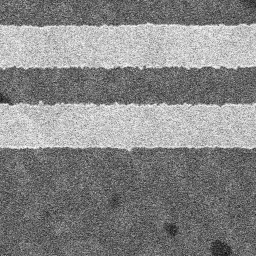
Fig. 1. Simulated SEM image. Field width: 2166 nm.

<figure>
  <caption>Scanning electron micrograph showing one or a few lines or trenches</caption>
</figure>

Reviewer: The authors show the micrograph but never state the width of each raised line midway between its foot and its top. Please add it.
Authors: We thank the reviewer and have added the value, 352 nm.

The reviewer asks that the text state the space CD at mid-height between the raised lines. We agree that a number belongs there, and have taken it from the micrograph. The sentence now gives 323 nanometers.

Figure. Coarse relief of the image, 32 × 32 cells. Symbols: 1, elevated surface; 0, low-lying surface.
00000000000000000000000000000000
00000000000000000000000000000000
00000000000000000000000000000000
11111111111111111111111111111111
11111111111111111111111111111111
11111111111111111111111111111111
11111111111111111111111111111111
11111111111111111111111111111111
00010000000000000000000000000000
00000000000000000000110000000000
00000000000000000000000000000000
00000000000000000000000000000000
00000000000000000000000000000000
11111111111111111111111111111111
11111111111111111111111111111111
11111111111111111111111111111111
11111111111111111111111111111111
11111111111111111111111111111111
00001100000000011000000000000000
00000100000000000000000000000000
00000000000000000000010000000000
00000000000000000000000000000000
00000000000000000000000000000000
00000000000000000000000000000000
00000000000000000001000000000000
00000000000000000001000000000000
00000000000000000000000000010000
00000000010000000000000000000000
00000000000000000000000100000000
00000000000000000000000000000000
00000000000000000000000000000000
00000000000000000000000000000000